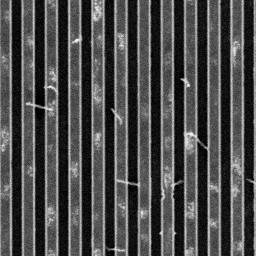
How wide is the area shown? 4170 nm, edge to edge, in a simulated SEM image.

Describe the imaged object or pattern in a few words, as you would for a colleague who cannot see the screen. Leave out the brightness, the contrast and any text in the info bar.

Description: parallel lines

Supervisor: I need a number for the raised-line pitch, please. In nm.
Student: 378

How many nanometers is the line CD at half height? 189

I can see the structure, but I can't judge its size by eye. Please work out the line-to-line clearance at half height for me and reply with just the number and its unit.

0.189 micrometres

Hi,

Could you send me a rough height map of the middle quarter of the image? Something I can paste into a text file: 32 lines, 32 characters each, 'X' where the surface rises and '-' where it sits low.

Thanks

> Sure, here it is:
-XXX---XXX---XXX---XX---XXX---XX
-XXX---XXX---XXX---XX---XXX---XX
-XXX---XXX---XXX---XX---XXX---XX
-XXX---XXX---XXX---XX----XX---XX
-XXX---XXX---XXX---XX----XX---XX
-XXX---XXX---XXX---XX----XX---XX
-XXX---XXX---XXX---XX----XX---XX
-XXX---XXX---XXX---XX----XX---XX
-XXX---XXX---XXX---XX----XX---XX
-XXX---XXX---XXX---XX----XX---XX
-XXX---XXX---XXX---XX----XX---XX
-XXX---XXX--XXXX---XX----XX---XX
-XXX---XXX---XXX---XX----XX---XX
-XXX---XXX---XXX---XX----XX---XX
-XXX---XXX---XXX---XX----XX---XX
-XXX---XXX---XXX---XX----XX---XX
-XXX---XXX---XXX---XX----XX---XX
-XXX---XXX---XXX---XX----XX---XX
-XXX---XXX---XXX---XX----XX---XX
-XXX---XXX---XXX---XX----XX---XX
-XXX---XXX---XXX---XX----XX---XX
-XXX---XXX---XXX---XX----XX---XX
-XXX---XXX---XXX---XX----XX---XX
-XXX---XXX---XXX---XX----XX---XX
-XXX---XXX---XXX---XX----XX---XX
-XXX---XXX---XXX---XX----XX---XX
-XXX---XXX---XXX---XX----XX---XX
-XXX---XXX---XXX---XX----XX---XX
-XXX---XXX---XXX---XX----XX---XX
-XXX---XXX---XXX---XX----XX---XX
-XXX---XXX---XXX--XXX----XX---XX
-XXX---XXX---XXX---XX----XX---XX